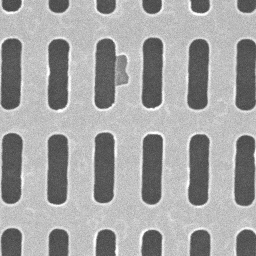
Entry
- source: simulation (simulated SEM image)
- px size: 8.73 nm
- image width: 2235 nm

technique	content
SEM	a regular array of holes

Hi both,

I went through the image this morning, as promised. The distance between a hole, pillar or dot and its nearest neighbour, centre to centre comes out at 404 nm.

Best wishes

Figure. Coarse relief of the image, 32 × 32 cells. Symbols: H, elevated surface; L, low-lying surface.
LLLHHHLLLHHHLLHHHHLLHHHHLLHHHHLL
HLHHHHHLHHHHLLHHHHLLHHHHLLHHHHLL
HHHHHHHHHHHHHHHHHHHHHHHHHHHHHHHH
HHHHHHHHHHHHHHHHHHHHHHHHHHHHHHHH
HHHHHHHHHHHHHHHHHHHHHHHHHHHHHHHH
LLLHHHLLLHHHLLHHHHLLHHHHLLHHHHLL
LLLHHHLLLHHHLLLHHHLLHHHHLLHHHHLL
LLLHHHLLLHHHLLLLHHLLHHHHLLHHHHLL
LLLHHHLLLHHHLLLLHHLLHHHLLLHHHLLL
LLLHHHLLLHHHLLLLHHLLHHHLLLHHHLLL
LLLHHHLLLHHHLLLLHHLLHHHLLLHHHLLL
LLLHHHLLLHHHLLHHHHLLHHHLLLHHHLLL
LLLHHHLLHHHHLLHHHHLLHHHLLLHHHLLL
LLHHHHLLHHHHLLHHHHHHHHHHLHHHHHLL
HHHHHHHHHHHHHHHHHHHHHHHHHHHHHHHH
HHHHHHHHHHHHHHHHHHHHHHHHHHHHHHHH
HHHHHHHHHHHHHHHHHHHHHHHHHHHHHHHH
LLLHHHLLLHHHLLHHHHLLHHHHLLHHHHLL
LLLHHHLLLHHHLLHHHHLLHHHHLLHHHLLL
LLLHHHLLLHHHLLHHHHLLHHHHLLHHHLLL
LLLHHHLLLHHHLLHHHHLLHHHHLLHHHLLL
LLLHHHLLLHHHLLHHHHLLHHHHLLHHHLLL
LLLHHHLLLHHHLLHHHHLLHHHHLLHHHLLL
LLLHHHLLHHHHLLHHHHLLHHHHLLHHHLLL
LLLHHHLLHHHHLLHHHHLLHHHLLLHHHLLL
HHHHHHHLHHHHHHHHHHLHHHHHLLHHHHLH
HHHHHHHHHHHHHHHHHHHHHHHHHHHHHHHH
HHHHHHHHHHHHHHHHHHHHHHHHHHHHHHHH
HLHHHHHHHHHHHHHHHHHHHHHHHHHHHHHH
LLLHHHLLLHHHLLHHHHLLHHHHLLHHHHLL
LLLHHHLLLHHHLLHHHHLLHHHHLLHHHLLL
LLLHHHLLLHHHLLHHHHLLHHHHLLHHHLLL